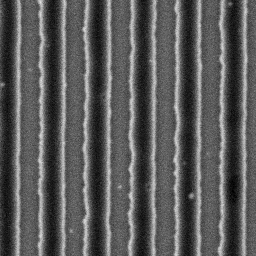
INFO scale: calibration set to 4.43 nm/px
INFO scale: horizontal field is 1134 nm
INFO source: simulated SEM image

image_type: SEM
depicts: lines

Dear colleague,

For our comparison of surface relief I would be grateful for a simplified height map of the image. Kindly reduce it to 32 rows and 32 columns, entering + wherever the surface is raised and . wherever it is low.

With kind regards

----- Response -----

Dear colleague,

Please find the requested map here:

++...+++...+++..+++...+++...+++.
++...+++...+++..+++...+++...+++.
++...+++...+++..+++...+++...+++.
++...+++...+++..+++...+++...+++.
++...+++...+++..+++...+++...+++.
++...+++...+++..+++...+++...+++.
++...+++...+++...++...+++...+++.
++...+++...+++..+++...+++...+++.
++...+++...+++..+++...+++...+++.
++...+++...+++..+++...+++...+++.
++...+++...+++..+++...+++...+++.
++...+++...+++..+++...+++...+++.
++...+++...+++..+++...+++...+++.
++...+++...+++..+++...+++...+++.
++...+++...+++..+++...+++...+++.
++...+++...+++..+++...+++...+++.
++...+++...+++..+++...+++...+++.
++...+++...+++..+++...+++...+++.
++...+++..++++..+++...+++...+++.
++...+++...+++...++...+++...+++.
++...+++...+++..+++...+++...+++.
++...+++...+++..+++...+++...+++.
++...+++...+++..+++...+++...+++.
++...+++...+++..+++...+++...+++.
++...+++...+++..+++...+++...+++.
++...+++...+++..+++...+++...+++.
++...+++...+++..+++...+++...+++.
++...+++...+++..+++...+++...+++.
++...+++...+++..+++...+++..++++.
++...+++...+++..+++...+++...+++.
++...+++...+++..+++...+++...+++.
++...+++...+++..+++...+++..++++.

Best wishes